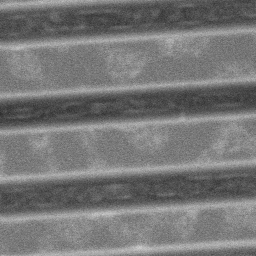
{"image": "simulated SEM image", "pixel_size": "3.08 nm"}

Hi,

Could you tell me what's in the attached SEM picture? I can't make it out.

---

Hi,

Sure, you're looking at one or a few lines or trenches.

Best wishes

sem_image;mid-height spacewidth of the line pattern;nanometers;110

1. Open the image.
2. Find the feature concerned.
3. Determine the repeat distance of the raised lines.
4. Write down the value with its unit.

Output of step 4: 257 nm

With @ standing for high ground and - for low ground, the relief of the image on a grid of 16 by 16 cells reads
----------------
----------------
-----@@@@@@@@@@@
@@@@@@@@@@@@@@@@
@@@@@@@@@@@@@@@@
@@@@@@@@@@------
----------------
---------@@@@@@@
@@@@@@@@@@@@@@@@
@@@@@@@@@@@@@@@@
@@@@@@@@@@@@----
----------------
----------------
-@@@@@@@@@@@@@@@
@@@@@@@@@@@@@@@@
@@@@@@@@@@@@----